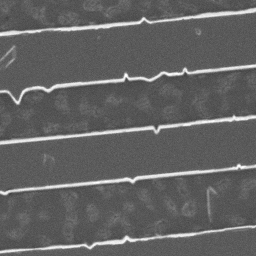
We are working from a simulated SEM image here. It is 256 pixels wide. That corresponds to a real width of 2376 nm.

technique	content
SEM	one or a few lines or trenches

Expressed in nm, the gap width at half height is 518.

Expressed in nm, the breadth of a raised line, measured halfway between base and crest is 484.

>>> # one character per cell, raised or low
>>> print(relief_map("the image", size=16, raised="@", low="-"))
----------------
-------@@@@@@@@@
@@@@@@@@@@@@@@@@
@@@@@@@@@@@@@@@@
@@@@@@@@@@@@@---
@@@-------------
----------------
--------------@@
----@@@@@@@@@@@@
@@@@@@@@@@@@@@@@
@@@@@@@@@@@@@@@-
@@@@@-----------
----------------
----------------
-------------@@@
---@@@@@@@@@@@@@